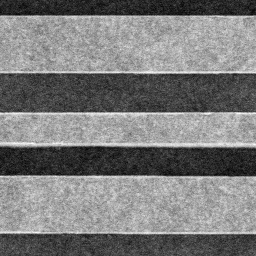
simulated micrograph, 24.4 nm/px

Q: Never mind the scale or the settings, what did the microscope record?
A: lines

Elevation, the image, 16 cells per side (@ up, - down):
----------------
@@@@@@@@@@@@@@@@
@@@@@@@@@@@@@@@@
@@@@@@@@@@@@@@@@
----------------
----------------
----------------
@@@@@@@@@@@@@@@@
@@@@@@@@@@@@@@@@
----------------
----------------
@@@@@@@@@@@@@@@@
@@@@@@@@@@@@@@@@
@@@@@@@@@@@@@@@@
--@@@@@@@@@@@@@@
----------------